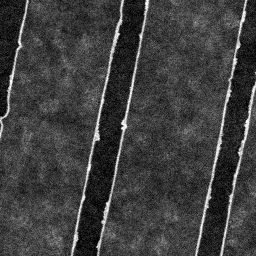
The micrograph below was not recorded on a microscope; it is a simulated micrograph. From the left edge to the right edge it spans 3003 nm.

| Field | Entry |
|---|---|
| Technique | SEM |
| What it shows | one or a few lines or trenches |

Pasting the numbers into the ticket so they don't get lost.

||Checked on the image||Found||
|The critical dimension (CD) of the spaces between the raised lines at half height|1120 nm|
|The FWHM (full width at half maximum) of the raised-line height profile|302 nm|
